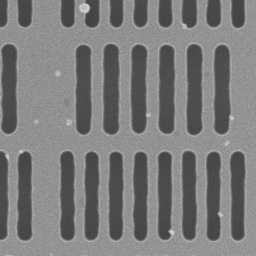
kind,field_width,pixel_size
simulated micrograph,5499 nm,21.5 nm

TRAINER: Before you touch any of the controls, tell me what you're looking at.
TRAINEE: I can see groups of lines, slits or small figures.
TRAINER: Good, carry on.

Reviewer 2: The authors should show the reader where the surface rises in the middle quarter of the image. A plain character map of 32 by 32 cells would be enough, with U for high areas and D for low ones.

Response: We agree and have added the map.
UUUDDDDUUUDDDDUUUDDDDUUUDDDDUUUD
UUUDDDDUUUDDDDUUUDDDDUUUDDDDUUUD
UUUDDDDUUUDDDDUUUDDDDUUUDDDDUUUD
UUUDDDDUUUDDDDUUUDDDDUUUDDDDUUUD
UUUDDDDUUUDDDDUUUDDDDUUUDDDDUUUD
UUUDDDDUUUDDDDUUUDDDDUUUDDDDUUUD
UUUDDDDUUUDDDDUUUDDDDUUUDDDDUUUD
UUUDDDDUUUDDDDUUUDDDDUUUDDDDUUUD
UUUDDDDUUUDDDDUUDDDDDUUUDDDDUUUD
UUUDDDDUUUDDDDUUUDDDDUUUDDDDUUUD
UUUDDDDUUUDDDDUUUDDDDUUUDDDDUUUD
UUUDDDDUUUDDDDUUUDDDDUUUDDDDUUDD
UUUDDDDUUUDDDDUUUDDDDUUUDDDDUUDD
UUUDDDDUUUDDDDUUUDDDDUUUDDDDUUUD
UUUDDDDUUUDDDDUUUDDDDUUDDDDDUUUD
UUUDDDDUUUDDDDUUUDDDDUUUDDDDUUUD
UUUDDDDUUUDDDDUUUDDDUUUUDDDUUUUD
UUUUDDUUUUUDDUUUUUDUUUUUUDUUUUUD
UUUUUUUUUUUUUUUUUUUUUUUUUUUUUUUU
UUUUUUUUUUUUUUUUUUUUUUUUUUUUUUUU
UUUUUUUUUUUUUUUUUUUUUUUUUUUUUUUU
UUUUUUUUUUUUUUUUUUUUUUUUUUUUUUUU
DDUUUUDDUUUUDDUUUUDDDUUUDDDUUUDD
DDDUUDDDDUUDDDDUUDDDDUUDDDDUUUDD
DDDUUDDDDUUDDDDUUDDDDUUDDDDUUDDD
DDDUUDDDDUUDDDDUUDDDDUUDDDDUUUDD
DDDUUDDDDUUDDDDUUDDDDUUDDDDUUUDD
DDDUUDDDDUUDDDDUUDDDDUUDDDDUUDDD
DDDUUDDDDUUDDDDUUDDDDUUDDDDUUDDD
DDDUUDDDDUUDDDDUUDDDDUUDDDDUUUDD
DDDUUDDDDUUDDDDUUDDDDUUDDDDUUUDD
DDDUUDDDDUUDDDDUUDDDDUUDDDDUUUDD